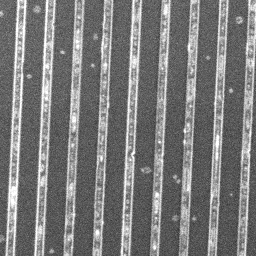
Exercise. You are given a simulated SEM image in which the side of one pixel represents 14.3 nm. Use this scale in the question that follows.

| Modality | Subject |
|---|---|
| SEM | parallel lines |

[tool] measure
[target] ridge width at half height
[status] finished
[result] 0.109 micrometres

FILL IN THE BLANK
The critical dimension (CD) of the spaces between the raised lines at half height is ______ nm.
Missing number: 302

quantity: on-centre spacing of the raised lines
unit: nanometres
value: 412